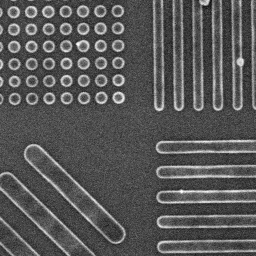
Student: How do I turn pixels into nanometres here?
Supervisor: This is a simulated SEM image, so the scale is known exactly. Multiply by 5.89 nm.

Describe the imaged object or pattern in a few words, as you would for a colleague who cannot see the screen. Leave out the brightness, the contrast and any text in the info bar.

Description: groups of lines, slits or small figures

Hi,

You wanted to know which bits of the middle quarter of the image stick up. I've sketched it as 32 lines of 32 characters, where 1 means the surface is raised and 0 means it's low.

11001100110011100000000110001100
00000000000000000000000110001100
00000000000000000000000110001100
11001100110011100000000110001100
11001100111011100000000110001100
00000000000000000000000110001100
00000000000000000000000110001100
11001100110001100000000110001100
11001100111011100000000110001100
11001100110001000000000110001100
00000000000000000000000110001100
00000000000000000000000000000000
00000000000000000000000000000000
00000000000000000000000000000000
00000000000000000000000000000000
00000000000000000000000000000000
00000000000000000000000000000000
00000000000000000000000000000000
00000000000000000000000000000000
00000000000000000000000011111111
00000000000000000000000111111111
00000000000000000000000111111111
00000000000000000000000000000000
00000000000000000000000000000000
00000000000000000000000000000000
00000000000000000000000000000000
00000000000000000000000111111111
10000000000000000000000111111111
11000000000000000000000000000000
11100000000000000000000000000000
11110000000000000000000000000000
11111000000000000000000000000000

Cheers